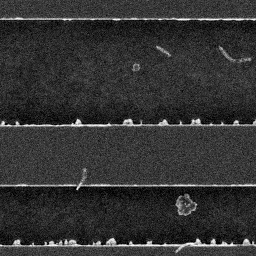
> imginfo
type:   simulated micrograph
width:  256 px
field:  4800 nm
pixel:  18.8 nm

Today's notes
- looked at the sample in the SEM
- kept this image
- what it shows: lines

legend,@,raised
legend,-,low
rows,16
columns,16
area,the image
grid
@@@@@@@@@@@@@@@@
----------------
----------------
----------------
----------------
----------------
----------------
----------------
@@@@@@@@@@@@@@@@
@@@@@@@@@@@@@@@@
@@@@@@@@@@@@@@@@
@@@@@@@@@@@@@@@@
----------------
----------------
----------------
@@@@@@@@@@@@@@@@